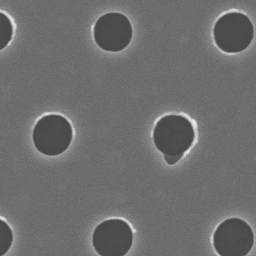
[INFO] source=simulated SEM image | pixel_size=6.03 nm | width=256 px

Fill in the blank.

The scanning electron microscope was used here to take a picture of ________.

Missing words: holes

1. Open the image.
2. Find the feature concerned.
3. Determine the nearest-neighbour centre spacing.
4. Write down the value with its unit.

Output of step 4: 723 nanometers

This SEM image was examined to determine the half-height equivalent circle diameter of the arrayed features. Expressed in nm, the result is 242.